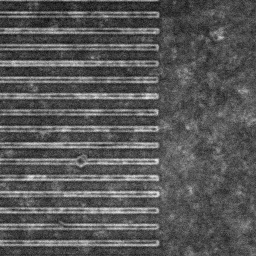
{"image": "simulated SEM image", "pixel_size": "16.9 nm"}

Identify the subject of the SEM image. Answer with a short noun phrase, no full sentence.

parallel lines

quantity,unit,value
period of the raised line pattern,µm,0.275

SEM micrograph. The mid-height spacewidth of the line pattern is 204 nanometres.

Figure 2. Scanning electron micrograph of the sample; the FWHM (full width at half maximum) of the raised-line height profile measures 63.2 nanometers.